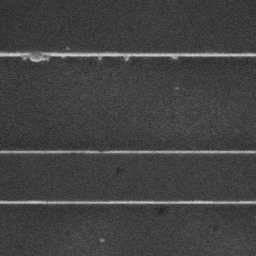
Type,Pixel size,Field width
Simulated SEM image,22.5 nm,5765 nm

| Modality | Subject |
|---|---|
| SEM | lines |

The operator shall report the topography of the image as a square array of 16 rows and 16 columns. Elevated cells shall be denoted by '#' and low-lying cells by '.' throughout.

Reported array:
################
################
################
..#...##........
................
................
................
................
................
################
################
################
################
................
................
................